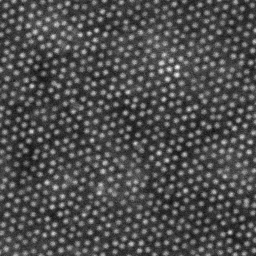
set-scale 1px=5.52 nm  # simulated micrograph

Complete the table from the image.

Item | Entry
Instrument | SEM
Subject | a regular array of raised bodies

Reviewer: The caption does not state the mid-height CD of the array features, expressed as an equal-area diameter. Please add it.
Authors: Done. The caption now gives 25.7 nm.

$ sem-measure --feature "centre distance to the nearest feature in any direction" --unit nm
45.6